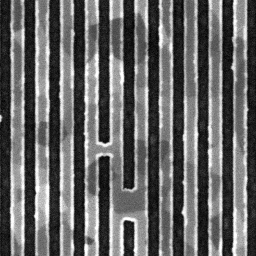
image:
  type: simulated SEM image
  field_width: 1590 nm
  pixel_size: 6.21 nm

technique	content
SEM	parallel lines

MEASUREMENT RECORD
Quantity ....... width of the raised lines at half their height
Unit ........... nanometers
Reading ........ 77.6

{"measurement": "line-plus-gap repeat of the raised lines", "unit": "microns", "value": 0.153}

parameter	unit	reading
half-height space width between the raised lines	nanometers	77.6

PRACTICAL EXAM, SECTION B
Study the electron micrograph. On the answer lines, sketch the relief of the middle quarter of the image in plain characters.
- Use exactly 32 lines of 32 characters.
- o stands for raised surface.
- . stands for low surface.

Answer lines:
oo...ooo....ooo...ooo...ooo...oo
oo...ooo....ooo...ooo...ooo...oo
oo...oooo...ooo...ooo...ooo...oo
oo...ooo....ooo...ooo...ooo...oo
oo...ooo....ooo...ooo...ooo...oo
oo...ooo....ooo...ooo...ooo...oo
oo...ooo....ooo...ooo...ooo...oo
oo...ooo....ooo...ooo...ooo...oo
oo...ooo....ooo...ooo...ooo...oo
oo...ooo....ooo...ooo...ooo...oo
oo....oo....ooo...ooo...ooo...oo
oo...ooo....ooo...ooo...ooo...oo
oo...ooo....ooo...ooo...ooo...oo
oo...ooo....ooo...ooo...ooo...oo
oo...ooo....oo....ooo...ooo...oo
oo...ooo....oo....ooo...ooo...oo
oo...ooo....ooo...ooo...ooo...oo
oo...ooo....ooo...ooo...ooo...oo
oo...ooo....ooo...ooo...ooo...oo
oo...oooo..oooo...ooo...ooo...oo
oo...oooooooooo...ooo...ooo...oo
oo...oooooooooo...ooo...ooo...oo
oo...oooooooooo...ooo...ooo...oo
oo...ooo....ooo...ooo...ooo...oo
oo...ooo....ooo...ooo...ooo...oo
oo...oooo...ooo...ooo...ooo...oo
oo...oooo...ooo...ooo...ooo...oo
oo...oooo...ooo...ooo...ooo...oo
oo...ooo....ooo...ooo...ooo...oo
oo...ooo....ooo...ooo...ooo...oo
ooo..oooo...ooo...ooo...ooo...oo
oo...oooo...oooo.oooo...ooo...oo